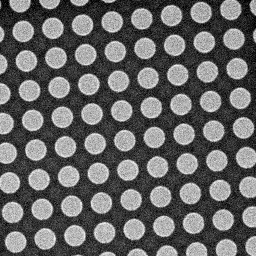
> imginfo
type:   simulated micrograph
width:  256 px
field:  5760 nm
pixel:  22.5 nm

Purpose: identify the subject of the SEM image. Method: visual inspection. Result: an array of small figures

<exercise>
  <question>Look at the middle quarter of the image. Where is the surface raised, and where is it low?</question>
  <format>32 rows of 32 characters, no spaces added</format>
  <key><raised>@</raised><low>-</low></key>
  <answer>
---------------------------@@@--
--------------------@@----@@@@@-
------------@@@----@@@@---@@@@@-
----@@@@---@@@@@---@@@@---@@@@@-
@---@@@@@--@@@@@---@@@@----@@@--
@---@@@@@--@@@@@----@@@---------
@---@@@@----@@@-----------------
@-----@-------------------------
---------------------@-----@@@@-
-------------@@@----@@@@---@@@@@
------@@----@@@@---@@@@@---@@@@@
@----@@@@---@@@@@--@@@@@---@@@@-
@@---@@@@---@@@@@---@@@@----@@--
@@---@@@@----@@@----------------
@@----@@------------------------
@----------------------------@@-
---------------------@@@----@@@@
-------@-----@@@@---@@@@@---@@@@
@-----@@@@---@@@@@--@@@@@---@@@@
@@---@@@@@---@@@@@--@@@@@----@@@
@@@--@@@@@---@@@@----@@@--------
@@@---@@@@-----@----------------
@@----------------------------@-
----------------------@@-----@@@
---------------@@----@@@@---@@@@
-------@@@----@@@@---@@@@@--@@@@
@@@---@@@@@---@@@@---@@@@@---@@@
@@@@--@@@@@---@@@@----@@@-------
@@@@--@@@@@----@@@--------------
@@@----@@@----------------------
@@----------------------------@@
----------------@-----@@@@---@@@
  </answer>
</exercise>